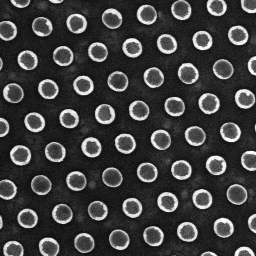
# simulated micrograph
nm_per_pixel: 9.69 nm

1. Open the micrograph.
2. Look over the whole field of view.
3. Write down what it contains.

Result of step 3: a regular array of raised bodies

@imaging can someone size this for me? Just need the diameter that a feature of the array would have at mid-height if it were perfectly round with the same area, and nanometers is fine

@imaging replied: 186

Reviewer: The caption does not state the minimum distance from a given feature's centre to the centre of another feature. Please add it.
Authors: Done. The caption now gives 336 nm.